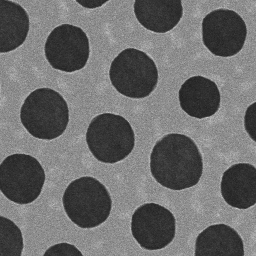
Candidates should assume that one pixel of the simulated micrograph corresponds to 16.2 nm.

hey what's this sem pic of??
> a regular array of holes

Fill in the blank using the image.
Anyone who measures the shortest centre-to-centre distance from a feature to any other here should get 1110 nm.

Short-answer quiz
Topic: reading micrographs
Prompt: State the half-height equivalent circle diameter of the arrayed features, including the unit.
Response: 0.787 microns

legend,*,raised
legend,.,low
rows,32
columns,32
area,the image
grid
..********...****......*********
...**************......***...***
....*************.....***.....**
....***...********....***......*
...***.....**************......*
...***.....***************.....*
.*****.....****...********....**
******.....***.....*************
*******...****......************
**************......************
**************......***....*****
****...********....***.....*****
***.....**************......****
***......**************....****.
***......***...*********..*****.
***.....***.....***************.
****....***......**************.
***********......***....********
***********......**......*******
*...********....***......*******
.....**************......*****.*
......*************......***....
......***...*******......***....
.....***.....********..*****....
*....***......**************....
********......****..*********...
********......***....***********
.********....***......**********
..**************......****...***
...**************.....***.....**
...****..********....***......**
...***....**************.......*